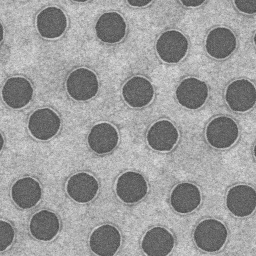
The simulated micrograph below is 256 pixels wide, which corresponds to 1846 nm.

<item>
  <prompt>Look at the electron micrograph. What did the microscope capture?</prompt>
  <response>a regular array of holes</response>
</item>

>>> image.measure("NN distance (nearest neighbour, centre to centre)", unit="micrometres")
0.354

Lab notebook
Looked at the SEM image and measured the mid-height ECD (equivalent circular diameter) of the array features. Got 229 nanometers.